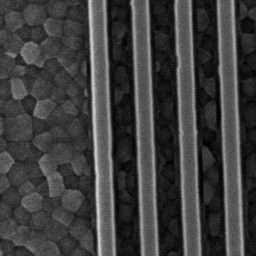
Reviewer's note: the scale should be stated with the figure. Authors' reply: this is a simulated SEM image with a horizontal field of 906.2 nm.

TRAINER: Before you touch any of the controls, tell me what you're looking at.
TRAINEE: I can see parallel lines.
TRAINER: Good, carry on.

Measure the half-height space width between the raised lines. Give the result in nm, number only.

95.9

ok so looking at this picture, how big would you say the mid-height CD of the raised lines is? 0.0553 microns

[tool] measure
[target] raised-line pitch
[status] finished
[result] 151 nanometers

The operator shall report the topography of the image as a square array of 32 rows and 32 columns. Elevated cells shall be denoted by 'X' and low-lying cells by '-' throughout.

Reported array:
-----------XX---XX----XX---XX---
-----------XX----XX---XX---XX---
-----------XX----XX---XX---XX---
-----------XX----XX---XX---XX---
-----------XX----XX---XX---XX---
-----------XX----XX---XX---XX---
-----------XX----XX---XX---XX---
-----------XX----XX---XX---XX---
-----------XXX---XX---XX---XX---
-----------XX----XX---XX----XX--
------------X----XX---XX----XX--
------------XX---XX---XX----XX--
------------XX---XX---XX----XX--
------------XX---XX---XX----XX--
------------XX---XX---XX----XX--
------------XX---XX---XX----XX--
------------XX---XX---XXX---XX--
------------XX---XX---XXX---XX--
------------XX---XX----XX---XX--
------------XX---XX----XX---XX--
------------XX---XX----XX---XX--
------------XX---XX----XX---XX--
------------XX---XX----XX---XX--
------------XX---XX----XX---XX--
------------XX---XX----XX---XX--
------------XX---XX----XX---XX--
------------XX---XX----XX---XX--
------------XX----XX---XX---XX--
------------XX----XX---XX---XX--
------------XX----XX---XX---XX--
------------XX----XX---XX---XX--
------------XX----XX---XX---XX--